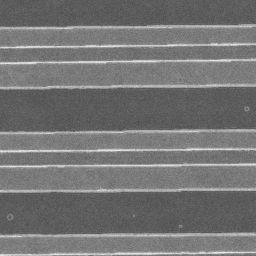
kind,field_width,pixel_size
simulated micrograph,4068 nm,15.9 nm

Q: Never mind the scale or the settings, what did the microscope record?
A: lines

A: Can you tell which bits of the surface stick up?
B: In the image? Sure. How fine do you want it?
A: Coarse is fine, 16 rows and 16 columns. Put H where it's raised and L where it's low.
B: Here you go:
LLLLLLLLLLLLLLLL
LLLLLLLLLLLLLLLL
HHHHHHHHHHHHHHHH
HHHHHHHHHHHHHHHH
HHHHHHHHHHHHHHHH
LLLLLLLLLLLLLLLL
LLLLLLLLLLLLLLLL
LLLLLLLLLLLLLLLL
HHHHHHHHHHHHHHHH
HHHHHHHHHHHHHHHH
HHHHHHHHHHHHHHHH
HHHHHHHHHHHHHHHH
LLLLLLLLLLLLLLLL
LLLLLLLLLLLLLLLL
LLLLLLLLLLLLLLLL
HHHHHHHHHHHHHHHH